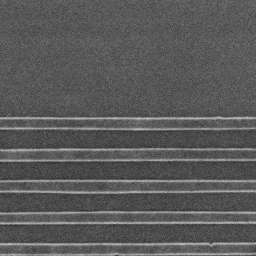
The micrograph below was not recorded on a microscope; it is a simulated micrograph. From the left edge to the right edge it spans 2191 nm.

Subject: parallel lines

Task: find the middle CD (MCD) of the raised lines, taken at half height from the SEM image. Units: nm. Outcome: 99.5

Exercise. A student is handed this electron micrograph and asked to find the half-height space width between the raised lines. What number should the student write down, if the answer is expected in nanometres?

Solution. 172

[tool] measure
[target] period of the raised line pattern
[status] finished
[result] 269 nm